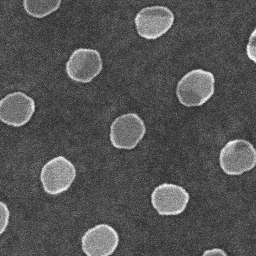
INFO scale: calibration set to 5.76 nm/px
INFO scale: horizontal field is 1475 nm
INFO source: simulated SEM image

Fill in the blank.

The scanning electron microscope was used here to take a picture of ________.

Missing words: raised bodies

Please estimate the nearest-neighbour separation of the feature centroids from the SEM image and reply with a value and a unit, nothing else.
454 nm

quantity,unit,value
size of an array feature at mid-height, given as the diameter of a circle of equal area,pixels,34